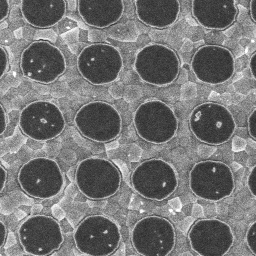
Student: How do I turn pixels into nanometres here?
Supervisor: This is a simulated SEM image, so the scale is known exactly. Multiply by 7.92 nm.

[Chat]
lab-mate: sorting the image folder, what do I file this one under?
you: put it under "a regular array of raised bodies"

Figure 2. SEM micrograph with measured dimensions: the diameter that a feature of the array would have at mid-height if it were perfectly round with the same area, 344 nm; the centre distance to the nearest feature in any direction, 449 nanometers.